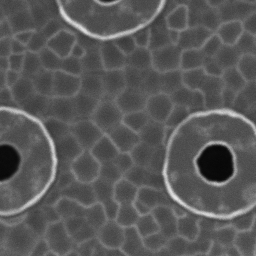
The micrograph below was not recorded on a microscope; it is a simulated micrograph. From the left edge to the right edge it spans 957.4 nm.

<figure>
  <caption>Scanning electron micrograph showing ring-shaped raised bodies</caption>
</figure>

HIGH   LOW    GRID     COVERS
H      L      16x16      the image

LLLLHHHHHHLLLLLL
LLLLHHHHHLLLLLLL
LLLLLLLLLLLLLLLL
LLLLLLLLLLLLLLLL
LLLLLLLLLLLLLLLL
LLLLLLLLLLLLLLLL
LLLLLLLLLLLLLLLL
HHLLLLLLLLLLHHHL
HHHLLLLLLLLHHHHH
LHHLLLLLLLHHHLHH
LHHLLLLLLLHHLLLH
HHHLLLLLLLHHHHHH
HHLLLLLLLLLHHHHH
LLLLLLLLLLLLLHHL
LLLLLLLLLLLLLLLL
LLLLLLLLLLLLLLLL